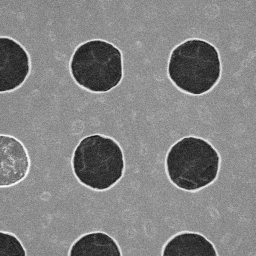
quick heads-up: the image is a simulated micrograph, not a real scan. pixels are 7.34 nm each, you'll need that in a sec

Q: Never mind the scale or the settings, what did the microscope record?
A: holes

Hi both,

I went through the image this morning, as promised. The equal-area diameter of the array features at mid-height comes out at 0.384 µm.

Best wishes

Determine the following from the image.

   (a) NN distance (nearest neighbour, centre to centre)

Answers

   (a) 699 nanometers